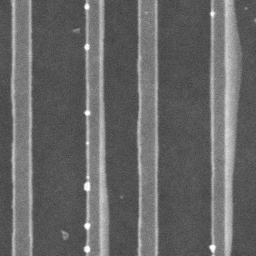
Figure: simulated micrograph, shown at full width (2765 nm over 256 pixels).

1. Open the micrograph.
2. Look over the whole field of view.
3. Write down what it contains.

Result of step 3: lines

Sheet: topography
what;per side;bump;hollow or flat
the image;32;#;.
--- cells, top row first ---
..##.......##....##........##...
..##.......##....##.......###...
..##.......##....##........##...
..##.......##....##........##...
..##.......##....##........##...
..##.......##....##........##...
..##.......##....##........##...
..##.......##....##........##...
..##.......##....##........##...
..##.......##....##........##...
..##.......##....##........##...
..##.......##....##........##...
..##.......##....##........##...
..##.......##....##........##...
..##.......##....##........##...
..##.......##....##........##...
..##.......##....##........##...
..##.......##....##........##...
..##.......##....##........##...
..##.......##....##........##...
..##.......##....##........##...
..##.......##....##........##...
..##.......##....##........##...
..##.......##....##........##...
..##.......##....##........##...
..##.......##....##........##...
..##.......##....##........##...
..##.......##....##........##...
..##.......##....###.......##...
..##.......##....###.......##...
..##.......##....###......###...
..##.......##....###......###...